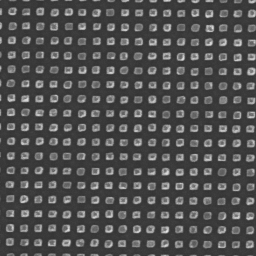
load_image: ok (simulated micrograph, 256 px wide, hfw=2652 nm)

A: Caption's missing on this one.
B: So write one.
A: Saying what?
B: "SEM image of a regular array of raised bodies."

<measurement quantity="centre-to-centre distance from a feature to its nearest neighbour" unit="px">13.9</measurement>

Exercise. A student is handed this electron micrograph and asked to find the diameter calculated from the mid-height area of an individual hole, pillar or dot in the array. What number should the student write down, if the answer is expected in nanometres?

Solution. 84.3